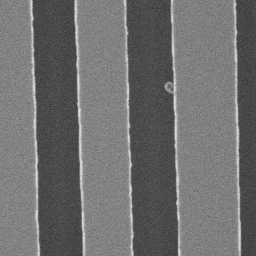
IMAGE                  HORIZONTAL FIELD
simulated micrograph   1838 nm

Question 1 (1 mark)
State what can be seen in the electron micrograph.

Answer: lines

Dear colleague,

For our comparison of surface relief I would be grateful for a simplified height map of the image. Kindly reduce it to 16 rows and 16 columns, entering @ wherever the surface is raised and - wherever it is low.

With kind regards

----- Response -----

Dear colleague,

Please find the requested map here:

@@---@@@---@@@@-
@@---@@@---@@@@-
@@---@@@---@@@@-
@@---@@@---@@@@-
@@---@@@---@@@@-
@@---@@@---@@@@-
@@---@@@---@@@@-
@@---@@@---@@@@-
@@---@@@---@@@@-
@@---@@@---@@@@-
@@---@@@---@@@@-
@@---@@@---@@@@-
@@---@@@---@@@@-
@@---@@@---@@@@-
@@---@@@---@@@@-
@@---@@@---@@@@-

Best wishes